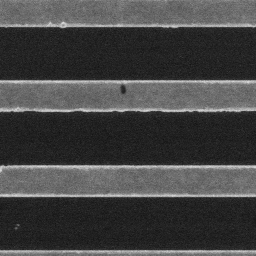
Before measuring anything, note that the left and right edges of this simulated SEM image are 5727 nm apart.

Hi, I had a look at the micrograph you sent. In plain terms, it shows lines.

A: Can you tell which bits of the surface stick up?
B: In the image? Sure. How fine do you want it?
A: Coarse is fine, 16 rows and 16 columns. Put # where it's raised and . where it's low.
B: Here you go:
################
################
................
................
................
################
################
................
................
................
################
################
................
................
................
................